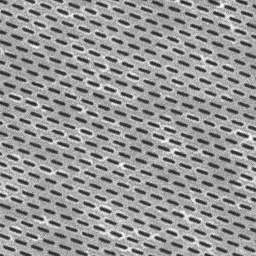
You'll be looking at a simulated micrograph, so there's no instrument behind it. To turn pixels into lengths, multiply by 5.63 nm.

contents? a regular array of holes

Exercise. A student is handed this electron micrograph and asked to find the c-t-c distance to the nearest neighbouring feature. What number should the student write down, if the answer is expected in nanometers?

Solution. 72.4